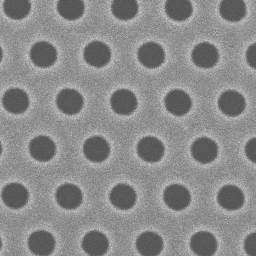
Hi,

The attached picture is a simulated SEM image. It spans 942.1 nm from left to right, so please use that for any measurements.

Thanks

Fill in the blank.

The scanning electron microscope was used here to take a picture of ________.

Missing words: a regular array of holes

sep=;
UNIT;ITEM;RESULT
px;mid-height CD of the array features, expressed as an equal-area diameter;27.6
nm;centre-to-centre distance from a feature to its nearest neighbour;198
